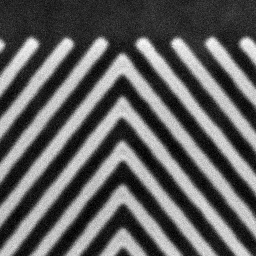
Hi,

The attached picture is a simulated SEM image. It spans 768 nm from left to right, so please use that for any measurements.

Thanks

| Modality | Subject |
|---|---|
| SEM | groups of lines, slits or small figures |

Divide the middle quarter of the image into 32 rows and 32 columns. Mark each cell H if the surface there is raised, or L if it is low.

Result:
LLLLHHHLLLLLHHHHHLLLLLHHHHLLLLLH
LLLHHHLLLLLHHHHHHHLLLLLHHHLLLLLL
LLHHHLLLLLLHHHLHHHHLLLLLHHHLLLLL
LHHHLLLLLLHHHLLLHHHLLLLLLHHHLLLL
HHHHLLLLLHHHLLLLLHHHLLLLLLHHHLLL
HHHLLLLLHHHLLLLLLLHHHLLLLLHHHHLL
HHLLLLLHHHHLLLLLLLHHHHLLLLLHHHHL
HLLLLLLHHHLLLLLLLLLHHHHLLLLLHHHL
LLLLLLHHHLLLLLLLLLLLHHHHLLLLLHHH
LLLLLHHHLLLLLLHHLLLLLHHHLLLLLLHH
LLLLHHHLLLLLLHHHLLLLLLHHHLLLLLLH
LLLHHHHLLLLLHHHHHLLLLLLHHHLLLLLH
LLLHHHLLLLLHHHHHHHLLLLLHHHHLLLLL
LLHHHLLLLLLHHHLHHHHLLLLLHHHHLLLL
LHHHLLLLLLHHHLLLHHHHLLLLLHHHLLLL
HHHHLLLLLHHHLLLLLHHHLLLLLLHHHLLL
HHHLLLLLHHHLLLLLLLHHHLLLLLLHHHLL
HHLLLLLHHHHLLLLLLLLHHHLLLLLHHHHL
HLLLLLHHHHLLLLLLLLLHHHHLLLLLHHHL
LLLLLLHHHLLLLLLLLLLLHHHHLLLLLHHH
LLLLLHHHLLLLLHHHLLLLLHHHHLLLLLHH
LLLLHHHHLLLLLHHHHLLLLLHHHLLLLLLH
LLLHHHLLLLLLHHHHHHLLLLLHHHLLLLLH
LLLHHHLLLLLHHHHHHHLLLLLHHHHLLLLL
LLHHHLLLLLHHHLLLHHHLLLLLLHHHLLLL
LHHHLLLLLLHHHLLLLHHHLLLLLHHHLLLL
HHHLLLLLLHHHLLLLLHHHHLLLLLHHHLLL
HHHLLLLLHHHLLLLLLLHHHLLLLLLHHHLL
HHLLLLLHHHLLLLLLLLLHHHLLLLLLHHHL
HLLLLLHHHHLLLLLLLLLLHHHLLLLLHHHL
LLLLLLHHHLLLLLLLLLLLLHHHLLLLLHHH
LLLLLHHHLLLLLHHHLLLLLHHHLLLLLLHH